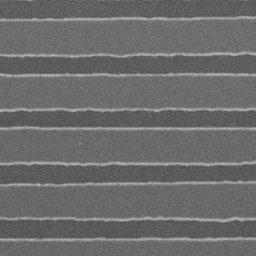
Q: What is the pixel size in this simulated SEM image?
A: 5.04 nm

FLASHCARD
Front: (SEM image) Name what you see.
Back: lines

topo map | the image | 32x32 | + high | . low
................................
................................
++++++++++++++++++++++++++++++++
++++++++++++++++++++++++++++++++
++++++++++++++++++++++++++++++++
++++++++++++++++++++++++++++++++
++++++++++++++++++++++++++++++++
................................
................................
++++++++++++++++++++++++++++++++
++++++++++++++++++++++++++++++++
++++++++++++++++++++++++++++++++
++++++++++++++++++++++++++++++++
++++++++++++++++++++++++++++++++
................................
................................
++++++++++++++++++++++++++++++++
++++++++++++++++++++++++++++++++
++++++++++++++++++++++++++++++++
++++++++++++++++++++++++++++++++
++.+....++++++.++++++.+++++++++.
................................
................................
++++++++++++++++++++++++++++++++
++++++++++++++++++++++++++++++++
++++++++++++++++++++++++++++++++
++++++++++++++++++++++++++++++++
.............+++...........++...
................................
................................
++++++++++++++++++++++++++++++++
++++++++++++++++++++++++++++++++